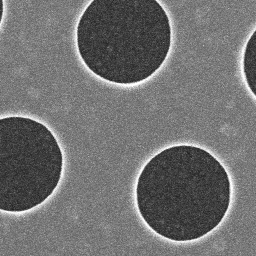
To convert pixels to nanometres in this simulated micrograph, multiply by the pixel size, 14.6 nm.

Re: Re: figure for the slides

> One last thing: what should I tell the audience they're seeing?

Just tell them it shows holes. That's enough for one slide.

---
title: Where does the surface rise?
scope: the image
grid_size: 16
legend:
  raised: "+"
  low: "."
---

+++++.....++++++
+++++......+++++
+++++......+++++
+++++.....+++++.
++++++....+++++.
++++++++++++++++
++++++++++++++++
..++++++++++++++
...+++++++++++++
....++++++...+++
....+++++.....++
....+++++.....++
...++++++.....++
+++++++++.....++
++++++++++...+++
++++++++++++++++